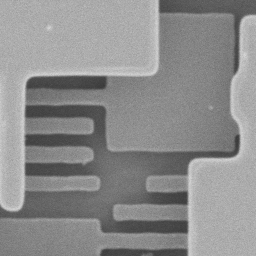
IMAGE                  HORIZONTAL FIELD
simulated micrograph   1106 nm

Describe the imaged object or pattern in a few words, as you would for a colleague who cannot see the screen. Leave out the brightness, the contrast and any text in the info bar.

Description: wiring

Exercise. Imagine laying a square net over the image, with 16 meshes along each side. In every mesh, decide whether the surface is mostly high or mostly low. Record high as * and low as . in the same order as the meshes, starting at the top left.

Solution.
**********......
**********.....*
**********.....*
**********.....*
**********.....*
**............**
**............**
*..............*
*..............*
*..............*
*...........****
*...........****
*...........****
............****
............****
............****